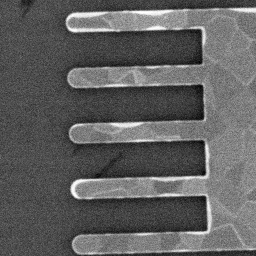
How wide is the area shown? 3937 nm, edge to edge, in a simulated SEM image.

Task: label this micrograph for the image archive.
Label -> groups of lines, slits or small figures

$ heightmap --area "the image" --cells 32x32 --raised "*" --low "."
................................
..............***...************
........************************
.........**********.****.*******
.........................*******
.........................*******
.........................*******
.........................*******
...............*****************
.........***********************
.........***********************
..........................******
..........................******
..........................******
..........................******
.............*...***************
.........***********************
.........**************..*******
..........................******
..........................******
..........................******
..........................******
............********************
.........***********************
..........**********......******
..........................******
..........................******
..........................******
..........................******
..........**********************
.........***********************
..........********..............